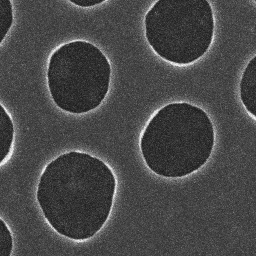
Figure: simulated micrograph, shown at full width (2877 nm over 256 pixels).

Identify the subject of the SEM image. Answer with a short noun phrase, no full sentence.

holes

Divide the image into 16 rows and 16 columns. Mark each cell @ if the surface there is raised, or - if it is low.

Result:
-@@@@@@@@----@@@
-@@@@@@@@----@@@
@@@@@@@@@----@@@
@@@---@@@@---@@@
@@@----@@@@@@@@-
@@@----@@@@@@@@-
@@@@--@@@@@-@@@-
-@@@@@@@@----@@@
-@@@@@@@@----@@@
-@@@@@@@@----@@@
@@@----@@---@@@@
@@-----@@@@@@@@@
@@-----@@@@@@@@@
@@@----@@@@@@@@@
-@@@--@@@@@@@@@@
-@@@@@@@@@@@@@@@